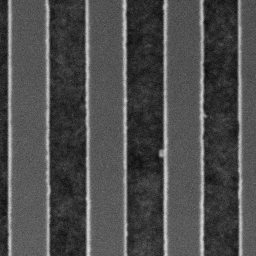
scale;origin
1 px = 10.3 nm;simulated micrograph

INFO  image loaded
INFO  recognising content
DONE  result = lines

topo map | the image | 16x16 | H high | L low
LHHLLHHHLLHHHLLH
LHHLLHHHLLHHHLLH
LHHLLHHHLLHHHLLH
LHHLLHHHLLHHHLLH
LHHLLHHHLLHHHLLH
LHHLLHHHLLHHHLLH
LHHLLHHHLLHHHLLH
LHHLLHHHLLHHHLLH
LHHLLHHHLLHHHLLH
LHHLLHHHLLHHHLLH
LHHLLHHHLLHHHLLH
LHHLLHHHLLHHHLLH
LHHLLHHHLLHHHLLH
LHHLLHHHLLHHHLLH
LHHLLHHHLLHHHLLH
LHHLLHHHLLHHHLLH